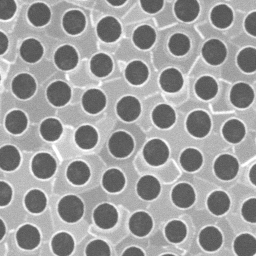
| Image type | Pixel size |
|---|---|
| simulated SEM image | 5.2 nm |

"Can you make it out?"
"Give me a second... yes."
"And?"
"a regular array of holes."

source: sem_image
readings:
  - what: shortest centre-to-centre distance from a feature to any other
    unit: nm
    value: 186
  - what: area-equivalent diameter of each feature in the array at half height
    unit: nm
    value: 134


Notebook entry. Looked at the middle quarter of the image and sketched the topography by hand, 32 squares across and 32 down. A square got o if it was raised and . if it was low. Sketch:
...ooo......ooo......ooooooooooo
..oooo......ooo......oooo....ooo
ooooooo.....ooo......ooo.....ooo
ooooooooooooooo......ooo......oo
oooooooooooooooo....oooo......oo
.oooooooooooooooo.oooooo......oo
..oooo...oooooooooooooooo....ooo
..ooo.....oooooooooooooooooooooo
..oo.......ooo....oooooooooooooo
.ooo.......oo......ooooooooooooo
ooooo.....ooo......oooo....ooooo
ooooo.....ooo......ooo......oooo
oooooo..ooooo......ooo......ooo.
oooooooooooooo....oooo......ooo.
ooooooooooooooo..ooooo......oo..
oooo...oooooooooooooooo....ooo..
ooo.....oooooo.oooooooooooooooo.
ooo......ooo....oooooooooooooooo
oo.......oo......ooooooooooooooo
ooo.....ooo.......ooo....ooooooo
ooo.....ooo.......oo......oooooo
ooooo.ooooo......ooo......oooo..
oooooooooooo.....ooo......ooo...
ooooooooooooo..ooooo......ooo...
oo...ooooooooooooooo......ooo...
o.....oooooooooooooooo..ooooo...
.......oooo...oooooooooooooooo..
.......ooo.....ooooooooooooooooo
o.....ooo......oooo....ooooooooo
o.....ooo.......oo......ooooo.oo
ooo.oooooo.....ooo......ooo.....
oooooooooo.....ooo......ooo.....